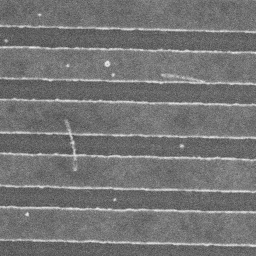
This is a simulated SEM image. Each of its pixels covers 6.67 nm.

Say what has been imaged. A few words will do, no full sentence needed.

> lines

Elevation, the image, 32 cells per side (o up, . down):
oooooooooooooooooooooooooooooooo
oooooooooooooooooooooooooooooooo
oooooooooooooooooooooooooooooooo
............oooooooooooooooooooo
................................
................................
oooooooooooooooooooooooooooo....
oooooooooooooooooooooooooooooooo
oooooooooooooooooooooooooooooooo
oooooooooooooooooooooooooooooooo
................................
................................
ooo.o..o........................
oooooooooooooooooooooooooooooooo
oooooooooooooooooooooooooooooooo
oooooooooooooooooooooooooooooooo
oooooooooooooooooooooooooooooooo
................................
................................
ooooooooooooooo.................
oooooooooooooooooooooooooooooooo
oooooooooooooooooooooooooooooooo
oooooooooooooooooooooooooooooooo
........oooooooooooooooooooooooo
................................
................................
oooooooooooooooooooooooooooooooo
oooooooooooooooooooooooooooooooo
oooooooooooooooooooooooooooooooo
oooooooooooooooooooooooooooooooo
.....................ooooooooooo
................................